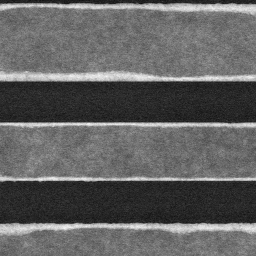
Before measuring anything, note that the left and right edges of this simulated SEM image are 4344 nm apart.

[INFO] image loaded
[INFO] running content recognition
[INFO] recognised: lines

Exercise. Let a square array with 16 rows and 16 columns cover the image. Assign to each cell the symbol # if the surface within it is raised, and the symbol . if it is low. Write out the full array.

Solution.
################
################
################
################
################
................
................
................
################
################
################
................
................
................
################
################